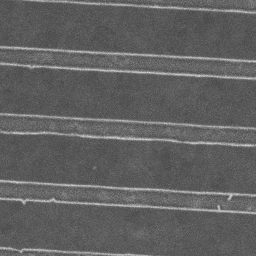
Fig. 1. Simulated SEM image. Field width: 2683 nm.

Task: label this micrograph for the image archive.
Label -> one or a few lines or trenches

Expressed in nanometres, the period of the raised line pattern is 701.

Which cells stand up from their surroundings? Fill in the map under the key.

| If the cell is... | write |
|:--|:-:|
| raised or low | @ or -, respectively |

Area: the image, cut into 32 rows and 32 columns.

@@@@@@@@@@@@@-------------------
@@@@@@@@@@@@@@@@@@@@@@@@@@@@@@@-
@@@@@@@@@@@@@@@@@@@@@@@@@@@@@@@@
@@@@@@@@@@@@@@@@@@@@@@@@@@@@@@@@
@@@@@@@@@@@@@@@@@@@@@@@@@@@@@@@@
@@@@@@@@@@@@@@@@@@@@@@@@@@@@@@@@
----------@@@@@@@@@@@@@@@@@@@@@@
------------------------------@@
@@@@@@@@------------------------
@@@@@@@@@@@@@@@@@@@@@@@@@@------
@@@@@@@@@@@@@@@@@@@@@@@@@@@@@@@@
@@@@@@@@@@@@@@@@@@@@@@@@@@@@@@@@
@@@@@@@@@@@@@@@@@@@@@@@@@@@@@@@@
@@@@@@@@@@@@@@@@@@@@@@@@@@@@@@@@
-----@@@@@@@@@@@@@@@@@@@@@@@@@@@
----------------------@@@@@@@@@@
--------------------------------
@@@@@@@@@@@@@@@@@@-@------------
@@@@@@@@@@@@@@@@@@@@@@@@@@@@@@@@
@@@@@@@@@@@@@@@@@@@@@@@@@@@@@@@@
@@@@@@@@@@@@@@@@@@@@@@@@@@@@@@@@
@@@@@@@@@@@@@@@@@@@@@@@@@@@@@@@@
@@@@@@@@@@@@@@@@@@@@@@@@@@@@@@@@
----------------@@@@@@@@@@@@@@@@
--------------------------------
@@@@@@@@@@@@--------------------
@@@@@@@@@@@@@@@@@@@@@@@@@@@@@@--
@@@@@@@@@@@@@@@@@@@@@@@@@@@@@@@@
@@@@@@@@@@@@@@@@@@@@@@@@@@@@@@@@
@@@@@@@@@@@@@@@@@@@@@@@@@@@@@@@@
@@@@@@@@@@@@@@@@@@@@@@@@@@@@@@@@
---------@@@@@@@@@@@@@@@@@@@@@@@